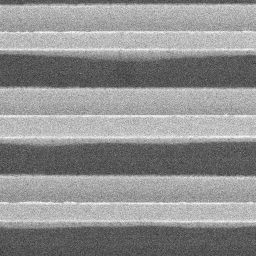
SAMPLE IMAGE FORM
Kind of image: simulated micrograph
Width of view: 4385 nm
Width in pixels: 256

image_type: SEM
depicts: lines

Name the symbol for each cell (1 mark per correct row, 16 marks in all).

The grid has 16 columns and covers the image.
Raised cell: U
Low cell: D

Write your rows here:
UUUUUUUUUUUUUUUU
UUUUUUUUUUUUUUUU
UUUUUUUUUUUUUUUU
DDDDDDDDDDDDDDDD
DDDDDDDDDDDDDDDD
DDDDDDDDDDDDDDDD
UUUUUUUUUUUUUUUU
UUUUUUUUUUUUUUUU
UUUUUUUUUUUUUUUU
DDDDDDDDDDDDDDDD
DDDDDDDDDDDDDDDD
UUUUUUUUUUUUUUUU
UUUUUUUUUUUUUUUU
UUUUUUUUUUUUUUUU
DDDDDDDDDDDDDDDD
DDDDDDDDDDDDDDDD